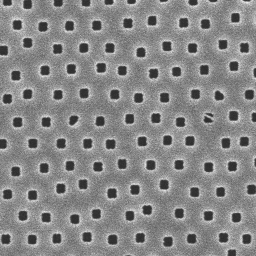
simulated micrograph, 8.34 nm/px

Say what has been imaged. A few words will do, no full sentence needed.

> a regular array of holes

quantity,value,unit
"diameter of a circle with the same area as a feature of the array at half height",0.0862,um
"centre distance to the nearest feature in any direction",197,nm